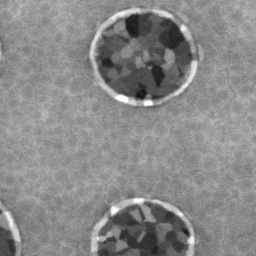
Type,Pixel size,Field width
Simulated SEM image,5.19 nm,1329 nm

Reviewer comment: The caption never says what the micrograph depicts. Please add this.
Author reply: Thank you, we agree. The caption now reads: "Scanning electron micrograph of raised bodies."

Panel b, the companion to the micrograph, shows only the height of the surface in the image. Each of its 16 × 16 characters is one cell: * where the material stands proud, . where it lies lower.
................
.......****.....
......******....
......******....
......******....
.......****.....
................
................
................
................
................
................
................
*......****.....
*.....******....
*.....******....